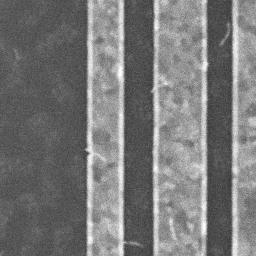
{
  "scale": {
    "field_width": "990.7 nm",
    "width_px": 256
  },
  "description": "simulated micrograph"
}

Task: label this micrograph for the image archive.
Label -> one or a few lines or trenches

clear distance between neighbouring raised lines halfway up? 128 nanometers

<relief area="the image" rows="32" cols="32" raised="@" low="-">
-----------@@@@-----@@@@@@---@@@
-----------@@@@-----@@@@@@---@@@
-----------@@@@-----@@@@@@---@@@
-----------@@@@-----@@@@@@---@@@
-----------@@@@-----@@@@@@---@@@
-----------@@@@-----@@@@@@---@@@
-----------@@@@-----@@@@@@---@@@
-----------@@@@-----@@@@@@---@@@
-----------@@@@-----@@@@@@---@@@
-----------@@@@-----@@@@@@---@@@
-----------@@@@----@@@@@@@---@@@
-----------@@@@----@@@@@@@---@@@
-----------@@@@-----@@@@@@---@@@
-----------@@@@-----@@@@@@---@@@
-----------@@@@-----@@@@@@---@@@
-----------@@@@-----@@@@@----@@@
-----------@@@@-----@@@@@----@@@
-----------@@@@----@@@@@@----@@@
-----------@@@@----@@@@@@@---@@@
-----------@@@@----@@@@@@@---@@@
-----------@@@@----@@@@@@@---@@@
-----------@@@@----@@@@@@@---@@@
-----------@@@@----@@@@@@@---@@@
-----------@@@@----@@@@@@@---@@@
-----------@@@@----@@@@@@@---@@@
-----------@@@@----@@@@@@@---@@@
-----------@@@@-----@@@@@@---@@@
-----------@@@@-----@@@@@@---@@@
-----------@@@@-----@@@@@@---@@@
-----------@@@@-----@@@@@----@@@
-----------@@@@-----@@@@@----@@@
-----------@@@@-----@@@@@----@@@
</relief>